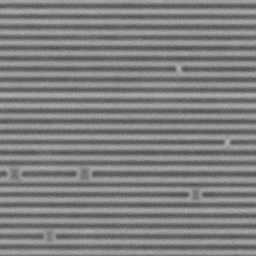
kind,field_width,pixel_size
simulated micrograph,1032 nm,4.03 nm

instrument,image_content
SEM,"parallel lines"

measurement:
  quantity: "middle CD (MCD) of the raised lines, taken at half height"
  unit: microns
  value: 0.0156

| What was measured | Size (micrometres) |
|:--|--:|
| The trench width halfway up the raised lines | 0.0237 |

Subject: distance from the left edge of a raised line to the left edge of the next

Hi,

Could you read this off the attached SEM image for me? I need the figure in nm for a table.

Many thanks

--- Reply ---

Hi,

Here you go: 42.1